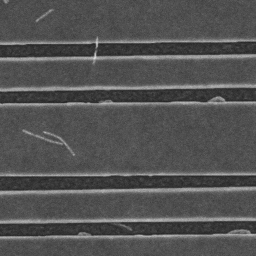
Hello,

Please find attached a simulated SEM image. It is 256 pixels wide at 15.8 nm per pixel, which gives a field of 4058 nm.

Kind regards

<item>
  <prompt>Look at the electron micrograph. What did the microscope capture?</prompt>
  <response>lines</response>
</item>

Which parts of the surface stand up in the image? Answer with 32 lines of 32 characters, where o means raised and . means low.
oooooooooooooooooooooooooooooooo
oooooooooooooooooooooooooooooooo
oooooooooooooooooooooooooooooooo
oooooooooooooooooooooooooooooooo
oooooooooooooooooooooooooooooooo
o...............................
................................
oooooooooooooooooooooooooooooooo
oooooooooooooooooooooooooooooooo
oooooooooooooooooooooooooooooooo
oooooooooooooooooooooooooooooooo
................................
................................
oooooooooooooooooooooooooooooooo
oooooooooooooooooooooooooooooooo
oooooooooooooooooooooooooooooooo
oooooooooooooooooooooooooooooooo
oooooooooooooooooooooooooooooooo
oooooooooooooooooooooooooooooooo
oooooooooooooooooooooooooooooooo
oooooooooooooooooooooooooooooooo
oooooooooooooooooooooooooooooooo
................................
...............................o
oooooooooooooooooooooooooooooooo
oooooooooooooooooooooooooooooooo
oooooooooooooooooooooooooooooooo
oooooooooooooooooooooo..........
................................
....................oooooooooooo
oooooooooooooooooooooooooooooooo
oooooooooooooooooooooooooooooooo